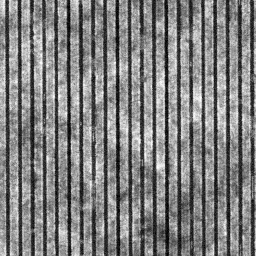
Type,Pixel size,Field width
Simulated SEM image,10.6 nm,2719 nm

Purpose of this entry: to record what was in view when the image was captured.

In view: parallel lines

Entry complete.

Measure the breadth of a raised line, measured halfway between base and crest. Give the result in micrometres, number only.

0.0823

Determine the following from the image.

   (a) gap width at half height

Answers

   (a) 50.4 nm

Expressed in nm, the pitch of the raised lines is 130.